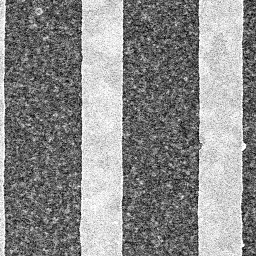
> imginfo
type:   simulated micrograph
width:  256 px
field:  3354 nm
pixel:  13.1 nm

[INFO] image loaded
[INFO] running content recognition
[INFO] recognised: one or a few lines or trenches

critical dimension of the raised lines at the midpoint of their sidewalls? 547 nanometers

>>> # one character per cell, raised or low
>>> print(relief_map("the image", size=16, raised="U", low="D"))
DDDDDUUUDDDDUUUD
DDDDDUUUDDDDUUUD
DDDDDUUUDDDDUUUD
DDDDDUUUDDDDUUUD
DDDDDUUUDDDDUUUD
DDDDDUUUDDDDUUUD
DDDDDUUUDDDDUUUD
DDDDDUUUDDDDDUUD
DDDDDUUUDDDDUUUD
DDDDDUUUDDDDDUUD
DDDDDUUUDDDDUUUD
DDDDDUUUDDDDUUUD
DDDDDUUUDDDDUUUD
DDDDDUUUDDDDUUUD
DDDDDUUUDDDDUUUD
DDDDDUUUDDDDUUUD